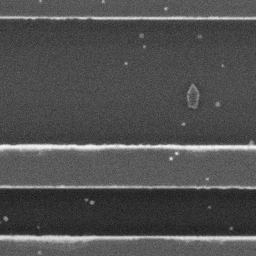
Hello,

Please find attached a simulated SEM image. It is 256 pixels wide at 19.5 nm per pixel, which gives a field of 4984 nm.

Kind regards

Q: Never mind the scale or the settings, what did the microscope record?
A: lines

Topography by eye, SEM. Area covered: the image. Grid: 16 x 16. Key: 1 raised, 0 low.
1111111111111111
0000000000000000
0000000000000000
0000000000000000
0000000000000000
0000000000000000
0000000000000000
0000000000000000
0000000000000000
1111111111111111
1111111111111111
1111111111111111
0000000000000000
0000000000000000
0000000000000000
1111111111111111